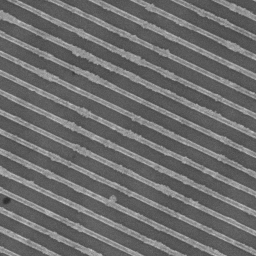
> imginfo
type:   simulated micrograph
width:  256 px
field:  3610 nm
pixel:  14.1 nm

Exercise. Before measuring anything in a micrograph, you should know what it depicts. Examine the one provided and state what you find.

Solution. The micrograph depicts parallel lines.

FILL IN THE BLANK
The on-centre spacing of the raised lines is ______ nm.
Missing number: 249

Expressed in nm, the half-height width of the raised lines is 66.8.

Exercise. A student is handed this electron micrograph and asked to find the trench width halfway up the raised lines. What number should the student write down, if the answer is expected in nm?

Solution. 188